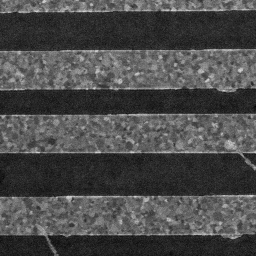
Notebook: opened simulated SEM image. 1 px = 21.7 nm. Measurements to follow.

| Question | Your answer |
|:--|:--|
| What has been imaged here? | lines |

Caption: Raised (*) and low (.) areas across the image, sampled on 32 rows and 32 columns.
********************************
****............................
................................
................................
................................
................................
********************************
********************************
********************************
********************************
********************************
................................
................................
................................
********************************
********************************
********************************
********************************
********************************
................................
................................
................................
................................
................................
.........................*******
********************************
********************************
********************************
********************************
................................
................................
................................